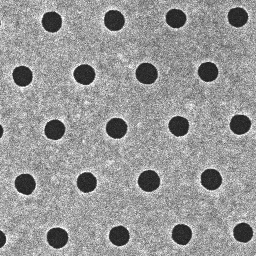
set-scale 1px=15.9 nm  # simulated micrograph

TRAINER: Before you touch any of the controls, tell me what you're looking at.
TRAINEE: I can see a regular array of holes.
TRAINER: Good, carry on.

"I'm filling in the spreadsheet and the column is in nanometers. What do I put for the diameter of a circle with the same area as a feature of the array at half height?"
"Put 338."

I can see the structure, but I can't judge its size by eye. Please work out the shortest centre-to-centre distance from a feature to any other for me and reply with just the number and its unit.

983 nm